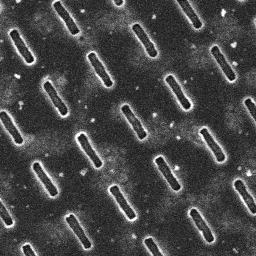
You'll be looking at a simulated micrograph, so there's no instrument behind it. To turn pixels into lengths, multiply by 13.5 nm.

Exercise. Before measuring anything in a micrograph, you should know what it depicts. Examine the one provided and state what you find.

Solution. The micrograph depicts a regular array of holes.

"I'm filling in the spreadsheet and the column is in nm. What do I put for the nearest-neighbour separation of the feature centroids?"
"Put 714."